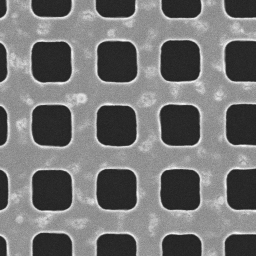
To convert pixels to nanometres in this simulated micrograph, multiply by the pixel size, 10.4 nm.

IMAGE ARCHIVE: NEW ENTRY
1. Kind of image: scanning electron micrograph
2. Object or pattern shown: a regular array of holes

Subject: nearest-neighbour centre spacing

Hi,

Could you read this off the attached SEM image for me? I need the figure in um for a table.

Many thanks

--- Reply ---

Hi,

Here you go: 0.661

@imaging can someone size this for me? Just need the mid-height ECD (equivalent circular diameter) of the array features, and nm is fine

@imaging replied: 461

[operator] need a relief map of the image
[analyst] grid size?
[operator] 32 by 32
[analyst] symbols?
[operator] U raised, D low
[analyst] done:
DUUUDDDDDUUUDDDDDUUUDDDDDUUUDDDD
DUUUDDDDDUUUDDDDDUUUDDDDDUUUDDDD
UUUUUUUUUUUUUUUUUUUUUUUUUUUUUUUU
UUUUUUUUUUUUUUUUUUUUUUUUUUUUUUUU
UUUUUUUUUUUUUUUUUUUUUUUUUUUUUUUU
UUUUDDDDUUUUDDDDDUUUDDDDDUUUDDDD
DUUUDDDDDUUUDDDDDUUUDDDDDUUUDDDD
DUUUDDDDDUUUDDDDDUUUDDDDDUUUDDDD
DUUUDDDDDUUUDDDDDUUUDDDDDUUUDDDD
DUUUDDDDDUUUDDDDDUUUDDDDDUUUDDDD
UUUUUUUUUUUUUUUUUUUUUUUUUUUUUUUU
UUUUUUUUUUUUUUUUUUUUUUUUUUUUUUUU
UUUUUUUUUUUUUUUUUUUUUUUUUUUUUUUU
UUUUDDDDUUUUDDDDUUUUDDDDDUUUUDDD
DUUUDDDDDUUUDDDDDUUUDDDDDUUUDDDD
DUUUDDDDDUUUDDDDDUUUDDDDDUUUDDDD
DUUUDDDDDUUUDDDDDUUUDDDDDUUUDDDD
DUUUDDDDDUUUDDDDDUUUDDDDDUUUDDDD
UUUUUUUUUUUUUUUUUUUUUUUUUUUUUUUU
UUUUUUUUUUUUUUUUUUUUUUUUUUUUUUUU
UUUUUUUUUUUUUUUUUUUUUUUUUUUUUUUU
UUUUUDDDUUUUUDDDDUUUUDDDDUUUUDDD
DUUUDDDDDUUUDDDDDUUUDDDDDUUUDDDD
DUUUDDDDDUUUDDDDDUUUDDDDDUUUDDDD
DUUUDDDDDUUUDDDDDUUUDDDDDUUUDDDD
DUUUDDDDDUUUDDDDDUUUDDDDDUUUUDDD
UUUUUUUUUUUUUUUUUUUUUUUUUUUUUUUU
UUUUUUUUUUUUUUUUUUUUUUUUUUUUUUUU
UUUUUUUUUUUUUUUUUUUUUUUUUUUUUUUU
UUUUUDDDDUUUUDDDUUUUUDDDDUUUUDDD
DUUUDDDDDUUUDDDDDUUUDDDDDUUUDDDD
DUUUDDDDDUUUDDDDDUUUDDDDDUUUDDDD